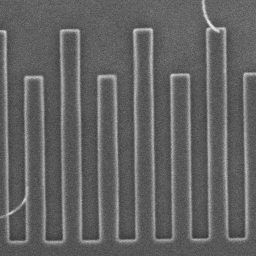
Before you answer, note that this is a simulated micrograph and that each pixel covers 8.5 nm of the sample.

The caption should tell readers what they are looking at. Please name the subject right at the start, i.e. groups of lines, slits or small figures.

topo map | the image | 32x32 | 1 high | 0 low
00000000000000000000000000000000
00000000000000000000000000000000
00000000000000000000000000000000
00000000000000000000000000100000
10000000110000000110000000110000
10000000110000000110000000110000
10000000110000000110000000110000
10000000110000000110000000110000
10000000110000000110000000110000
10000000110000000110001100110001
10011000110011000110011100110001
10011000110011000110011100110001
10011000110011000110011100110001
10011000110011000110011100110001
10011000110011000110011100110001
10011000110011000110001100110001
10011000110011000110001100110001
10011100110011100110001100110001
10011100110011100110001100110001
10011100110011100110001100110001
10011100110011100110001100110001
10011100110011100110001100110001
10011100110011100110001100110001
10011100110011100110001100110001
10011100110011100110001100110001
10011100110011100110001100110001
10011100110011100110001100110001
10011100110001100110001100110001
10011100110001100110001100110001
10011100110001100110001100111011
11111111111111111111111111111111
11111111111111111111111111111111